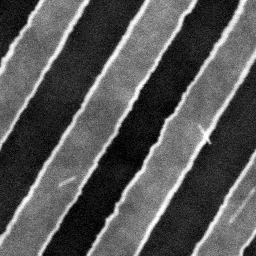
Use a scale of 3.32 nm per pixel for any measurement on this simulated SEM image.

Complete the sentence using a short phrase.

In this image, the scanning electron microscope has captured lines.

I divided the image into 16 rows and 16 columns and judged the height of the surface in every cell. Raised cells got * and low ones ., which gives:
..***....***...*
..***...***...**
.***....***...**
****...***...***
***...****..***.
**....***...***.
**...***...***..
*....***..****..
....***...***...
...****..***....
...***...***...*
..***...***....*
.****..****...**
.***...***...***
***...***....***
***...***...***.